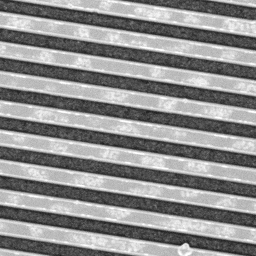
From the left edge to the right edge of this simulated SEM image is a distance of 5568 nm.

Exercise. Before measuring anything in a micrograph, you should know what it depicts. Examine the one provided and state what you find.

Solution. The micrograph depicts parallel lines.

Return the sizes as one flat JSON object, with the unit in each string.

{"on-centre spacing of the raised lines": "636 nm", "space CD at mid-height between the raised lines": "331 nanometers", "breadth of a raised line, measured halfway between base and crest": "0.296 micrometres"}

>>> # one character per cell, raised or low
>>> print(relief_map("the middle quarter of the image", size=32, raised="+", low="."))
+++++++++++++++++++++++.........
......+++++++++++++++++++++++...
.............+++++++++++++++++++
...................+++++++++++++
..........................++++++
+++++++.........................
+++++++++++++...................
++++++++++++++++++++............
.....+++++++++++++++++++++......
...........+++++++++++++++++++++
..................++++++++++++++
........................++++++++
+++++..........................+
+++++++++++.....................
++++++++++++++++++..............
..++++++++++++++++++++++........
........+++++++++++++++++++++++.
...............+++++++++++++++++
.....................+++++++++++
++..........................++++
++++++++........................
+++++++++++++++.................
+++++++++++++++++++++...........
.......+++++++++++++++++++++....
.............+++++++++++++++++++
...................+++++++++++++
..........................++++++
++++++..........................
+++++++++++++...................
++++++++++++++++++++............
...+++++++++++++++++++++++......
..........++++++++++++++++++++++